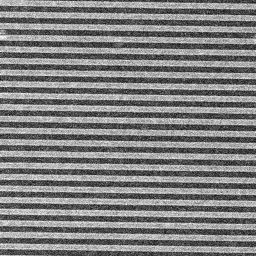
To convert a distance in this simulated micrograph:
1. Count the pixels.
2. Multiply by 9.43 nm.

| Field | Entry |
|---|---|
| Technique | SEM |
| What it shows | parallel lines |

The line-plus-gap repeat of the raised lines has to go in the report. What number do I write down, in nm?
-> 109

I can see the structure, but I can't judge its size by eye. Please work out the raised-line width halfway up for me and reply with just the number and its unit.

51.8 nm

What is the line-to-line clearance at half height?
56.5 nm